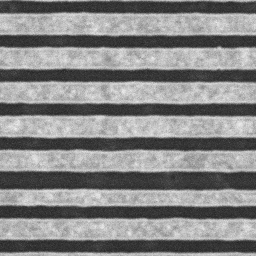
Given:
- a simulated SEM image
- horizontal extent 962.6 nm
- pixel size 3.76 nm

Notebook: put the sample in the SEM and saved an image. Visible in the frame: parallel lines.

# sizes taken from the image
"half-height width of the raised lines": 72.8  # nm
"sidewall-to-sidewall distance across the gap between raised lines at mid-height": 54.5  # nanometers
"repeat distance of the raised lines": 128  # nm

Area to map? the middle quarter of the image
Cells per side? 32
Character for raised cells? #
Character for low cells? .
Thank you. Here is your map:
################################
................................
................................
................................
................................
################################
################################
################################
################################
######.###.####.####....########
................................
................................
................................
###############################.
################################
################################
################################
################################
................................
................................
................................
................................
################################
################################
################################
################################
..#.##.#...################.####
................................
................................
................................
................................
................................